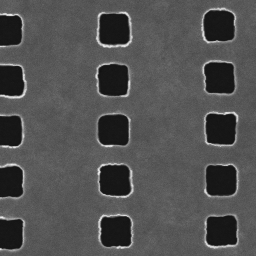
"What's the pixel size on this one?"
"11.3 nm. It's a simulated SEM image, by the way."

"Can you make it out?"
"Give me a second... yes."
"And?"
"a regular array of holes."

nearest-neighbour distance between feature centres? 0.571 micrometres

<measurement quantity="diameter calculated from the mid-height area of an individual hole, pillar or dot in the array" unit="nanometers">374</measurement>